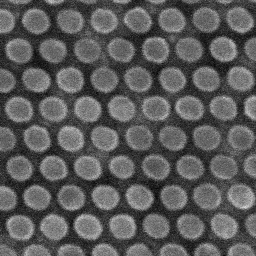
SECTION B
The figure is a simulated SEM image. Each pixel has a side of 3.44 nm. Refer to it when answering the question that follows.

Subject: a regular array of raised bodies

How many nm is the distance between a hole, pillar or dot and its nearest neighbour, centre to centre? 115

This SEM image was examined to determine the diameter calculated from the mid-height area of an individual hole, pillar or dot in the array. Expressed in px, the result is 24.3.